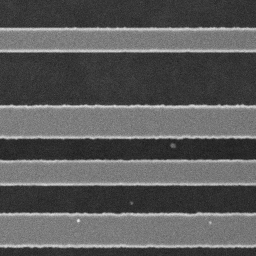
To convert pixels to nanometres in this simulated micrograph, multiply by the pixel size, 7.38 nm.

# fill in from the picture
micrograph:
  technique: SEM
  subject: lines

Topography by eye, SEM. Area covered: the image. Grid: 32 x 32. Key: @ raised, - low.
--------------------------------
--------------------------------
--------------------------------
-----------------------------@--
@@@@@@@@@@@@@@@@@@@@@@@@@@@@@@@@
@@@@@@@@@@@@@@@@@@@@@@@@@@@@@@@@
--------------------------------
--------------------------------
--------------------------------
--------------------------------
--------------------------------
--------------------------------
--------------------------------
@@@@@@@@@@@@@@@@@@@@@@@@@@@@@@@@
@@@@@@@@@@@@@@@@@@@@@@@@@@@@@@@@
@@@@@@@@@@@@@@@@@@@@@@@@@@@@@@@@
@@@@@@@@@@@@@@@@@@@@@@@@@@@@@@@@
--------------------------------
--------------------------------
--------------------------------
@@@@@@@@@@@@@@@@@@@@@@@@@@@@@@@@
@@@@@@@@@@@@@@@@@@@@@@@@@@@@@@@@
@@@@@@@@@@@@@@@@@@@@@@@@@@@@@@@@
--------------------------------
--------------------------------
--------------------------------
--------------------------------
@@@@@@@@@@@@@@@@@@@@@@@@@@@@@@@@
@@@@@@@@@@@@@@@@@@@@@@@@@@@@@@@@
@@@@@@@@@@@@@@@@@@@@@@@@@@@@@@@@
@@@@@@@@@@@@@@@@@@@@@@@@@@@@@@@@
--------------------------------